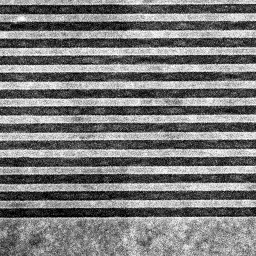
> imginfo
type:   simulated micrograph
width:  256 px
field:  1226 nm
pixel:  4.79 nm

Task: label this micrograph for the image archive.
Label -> parallel lines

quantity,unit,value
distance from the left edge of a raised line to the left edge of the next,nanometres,81.1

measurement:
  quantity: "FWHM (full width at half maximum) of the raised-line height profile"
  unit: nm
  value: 33.6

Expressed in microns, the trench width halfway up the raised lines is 0.0461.